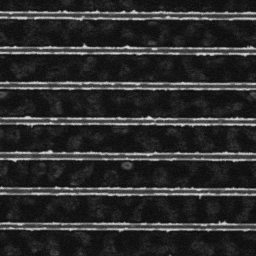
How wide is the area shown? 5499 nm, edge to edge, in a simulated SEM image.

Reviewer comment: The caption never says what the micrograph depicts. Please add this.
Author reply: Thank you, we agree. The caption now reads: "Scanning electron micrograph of parallel lines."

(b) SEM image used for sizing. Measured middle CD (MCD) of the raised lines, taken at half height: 0.142 um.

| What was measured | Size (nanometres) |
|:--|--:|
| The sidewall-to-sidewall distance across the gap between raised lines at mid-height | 602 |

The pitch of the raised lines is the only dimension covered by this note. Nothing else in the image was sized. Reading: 756 nm